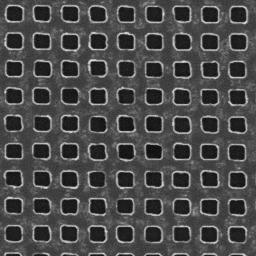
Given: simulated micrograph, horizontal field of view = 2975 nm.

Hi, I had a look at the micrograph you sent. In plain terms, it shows a regular array of holes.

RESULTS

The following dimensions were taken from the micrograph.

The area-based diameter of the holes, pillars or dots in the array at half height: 196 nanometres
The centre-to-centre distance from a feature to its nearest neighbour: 315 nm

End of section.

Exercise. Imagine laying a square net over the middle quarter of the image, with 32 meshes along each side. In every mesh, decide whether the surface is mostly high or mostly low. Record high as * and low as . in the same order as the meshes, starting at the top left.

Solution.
...***.....***....**....***....*
....**.....***....**.....**.....
...****...****....**.....**.....
********************************
********************************
********************************
...****...****...****...****...*
....**....***.....**.....**....*
....**.....***....**.....**....*
...****...****....***...****...*
********************************
********************************
********************************
...****...****...****...****...*
....**....****....**.....**....*
....**.....**.....**.....**.....
...****...****....***...****...*
********************************
********************************
********************************
...****...****...****...****...*
....**....***....***.....**.....
....**....***.....**.....**.....
...****...****...****...****...*
********************************
********************************
********************************
...***....***....****...***....*
....**....***....***.....**....*
....**....***....***.....**....*
...****...****...****...****...*
********************************